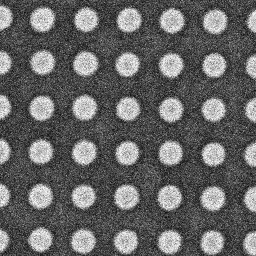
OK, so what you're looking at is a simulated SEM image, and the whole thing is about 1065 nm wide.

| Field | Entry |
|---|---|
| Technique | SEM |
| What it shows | a regular array of raised bodies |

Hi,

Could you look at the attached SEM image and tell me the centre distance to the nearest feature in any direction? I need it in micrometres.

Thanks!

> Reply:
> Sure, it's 0.178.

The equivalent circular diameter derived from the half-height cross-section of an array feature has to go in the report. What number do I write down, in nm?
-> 94.6